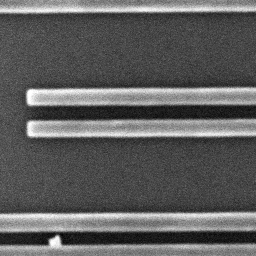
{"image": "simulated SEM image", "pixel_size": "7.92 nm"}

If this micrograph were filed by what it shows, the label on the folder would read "wiring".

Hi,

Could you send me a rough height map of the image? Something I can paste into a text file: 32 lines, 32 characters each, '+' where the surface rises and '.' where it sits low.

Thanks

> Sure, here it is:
++++++++++++++++++++++++++++++++
................................
................................
................................
................................
................................
................................
................................
................................
................................
................................
....++++++++++++++++++++++++++++
....++++++++++++++++++++++++++++
................................
................................
....++++++++++++++++++++++++++++
....++++++++++++++++++++++++++++
................................
................................
................................
................................
................................
................................
................................
................................
................................
................................
++++++++++++++++++++++++++++++++
++++++++++++++++++++++++++++++++
................................
......++........................
++++++++++++++++++++++++++++++++